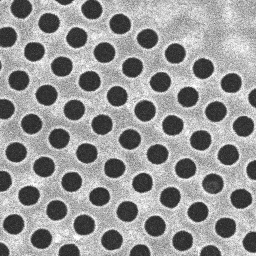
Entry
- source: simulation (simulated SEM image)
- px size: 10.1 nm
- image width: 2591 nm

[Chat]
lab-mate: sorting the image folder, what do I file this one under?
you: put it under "a regular array of holes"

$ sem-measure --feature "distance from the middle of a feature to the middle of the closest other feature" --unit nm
317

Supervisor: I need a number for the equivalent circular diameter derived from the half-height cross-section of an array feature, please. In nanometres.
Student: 215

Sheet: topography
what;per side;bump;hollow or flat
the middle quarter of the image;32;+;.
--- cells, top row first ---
..+++++++++++++.....++++++++++++
..+++++++++++++.....++++++++++++
.++++...+++++++....++++...++++++
++++.....+++++++++++++.....+++++
+++......++++++++++++......+++++
++++.....++++.++++++++.....+++++
+++++...+++....+++++++....+++...
+++++++++++.....++++++++++++....
+++++++++++.....++++++++++++....
+...+++++++.....+++...++++++....
.....++++++++.++++.....+++++++..
.....+++++++++++++.....+++++++++
.....+++++++++++++.....+++++++++
+...+++.....++++++....+++....+++
+++++++.....+++++++++++++.....++
+++++++.....+++++++++++++.....++
+++++++.....++++..+++++++.....++
.+++++++...+++.....+++++++...+++
.+++++++++++++.....+++++++++++++
.+++++++++++++.....++++++++++++.
.+++...+++++++.....+++...+++++++
+++.....+++++++++++++.....++++++
+++.....+++++++++++++.....++++++
+++.....++++.++++++++.....++++.+
++++...+++.....++++++....+++....
++++++++++.....+++++++++++++....
++++++++++.....+++++++++++++....
....++++++.....++++..+++++++....
....++++++++.++++.....++++++++.+
.....++++++++++++.....++++++++++
....+++++++++++++.....++++++++++
....+++....+++++++....+++....+++